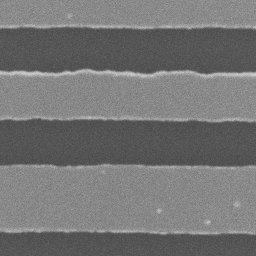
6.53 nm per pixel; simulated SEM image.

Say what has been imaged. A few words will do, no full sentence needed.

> lines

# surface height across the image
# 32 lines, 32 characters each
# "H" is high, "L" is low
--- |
HHHHHHHHHHHHHHHHHHHHHHHHHHHHHHHH
HHHHHHHHHHHHHHHHHHHHHHHHHHHHHHHH
HHHHHHHHHHHHHHHHHHHHHHHHHHHHHHHH
LLLLLLLLLLLLLLLLLHHLLLLHLLLLLLLH
LLLLLLLLLLLLLLLLLLLLLLLLLLLLLLLL
LLLLLLLLLLLLLLLLLLLLLLLLLLLLLLLL
LLLLLLLLLLLLLLLLLLLLLLLLLLLLLLLL
LLLLLLLLLLLLLLLLLLLLLLLLLLLLLLLL
LLLLLLLLLLLLLLLLLLLLLLLLLLLLLLLL
HHHHHHHHHHHHHHHHHHHHHHHHHHHHHHHH
HHHHHHHHHHHHHHHHHHHHHHHHHHHHHHHH
HHHHHHHHHHHHHHHHHHHHHHHHHHHHHHHH
HHHHHHHHHHHHHHHHHHHHHHHHHHHHHHHH
HHHHHHHHHHHHHHHHHHHHHHHHHHHHHHHH
HHHHHHHHHHHHHHHHHHHHHHHHHHHHHHHH
LLLLLLLLLLLLLLLLLLLLLLLLLLLLLLLL
LLLLLLLLLLLLLLLLLLLLLLLLLLLLLLLL
LLLLLLLLLLLLLLLLLLLLLLLLLLLLLLLL
LLLLLLLLLLLLLLLLLLLLLLLLLLLLLLLL
LLLLLLLLLLLLLLLLLLLLLLLLLLLLLLLL
LLLLLLLLLLLLLLLLLLLLLLLLLLLLLLLL
HHHHHHHHHHHHHHHHHHHHHHHHHHHHHHHH
HHHHHHHHHHHHHHHHHHHHHHHHHHHHHHHH
HHHHHHHHHHHHHHHHHHHHHHHHHHHHHHHH
HHHHHHHHHHHHHHHHHHHHHHHHHHHHHHHH
HHHHHHHHHHHHHHHHHHHHHHHHHHHHHHHH
HHHHHHHHHHHHHHHHHHHHHHHHHHHHHHHH
HHHHHHHHHHHHHHHHHHHHHHHHHHHHHHHH
HHHHHHHHHHHHHHHHHHHHHHHHHHHHHHHH
LLLLLLLLLLLLLLLLLLLLLLLLLLLLLLLL
LLLLLLLLLLLLLLLLLLLLLLLLLLLLLLLL
LLLLLLLLLLLLLLLLLLLLLLLLLLLLLLLL